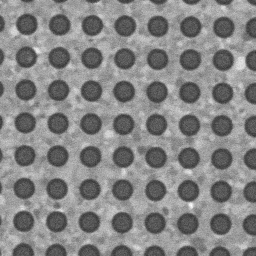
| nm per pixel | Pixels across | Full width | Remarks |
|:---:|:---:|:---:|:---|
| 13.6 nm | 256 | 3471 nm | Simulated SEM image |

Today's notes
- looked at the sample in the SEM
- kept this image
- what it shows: an array of small figures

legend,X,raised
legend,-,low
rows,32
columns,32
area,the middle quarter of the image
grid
-XXXX----XXXX----XXXX-----XXX---
XXXXXXXXXXXXXXX-XXXXXXX-XXXXXX--
XXXXXXXXXXXXXXXXXXXXXXXXXXXXXXXX
XXXXXXXXXXXXXXXXXXXXXXXXXXXXXXXX
XXXXX----XXXXX---XXXXX---XXXXXX-
-XXX-----XXXX----XXXX-----XXX---
-XXX------XX------XXX-----XXX---
-XXX------XX------XX------XXX---
-XXXX----XXXX----XXXX-----XXX---
XXXXXXX-XXXXXX--XXXXXX---XXXXX--
XXXXXXXXXXXXXXXXXXXXXXXXXXXXXXXX
XXXXXXXXXXXXXXXXXXXXXXXXXXXXXXXX
XXXXX---XXXXXX--XXXXXX--XXXXXXX-
-XXX-----XXXX----XXXX----XXXX---
-XXX-----XXX------XX------XXX---
-XXX------XX------XX------XX----
-XXX-----XXX-----XXXX-----XXX---
XXXXXX--XXXXXX--XXXXXX---XXXXX--
XXXXXXXXXXXXXXXXXXXXXXXXXXXXXXXX
XXXXXXXXXXXXXXXXXXXXXXXXXXXXXXXX
XXXXXX-XXXXXXXXXXXXXXXXXXXXXXXXX
-XXX-----XXXX----XXXX----XXXX---
-XXX-----XXX-----XXX------XXX---
-XXX-----XXX------XX------XX----
-XXX-----XXX-----XXX------XXX---
XXXXX---XXXXX----XXXX----XXXX---
XXXXXXXXXXXXXXXXXXXXXXXXXXXXXXXX
XXXXXXXXXXXXXXXXXXXXXXXXXXXXXXXX
XXXXXXXXXXXXXXXXXXXXXXXXXXXXXXXX
XXXX-----XXXX---XXXXX----XXXX---
-XXX-----XXX-----XXX-----XXXX---
-XXX-----XXX-----XXX------XX----